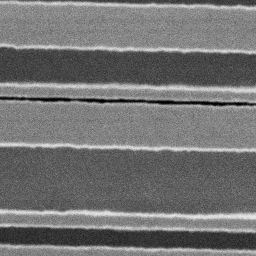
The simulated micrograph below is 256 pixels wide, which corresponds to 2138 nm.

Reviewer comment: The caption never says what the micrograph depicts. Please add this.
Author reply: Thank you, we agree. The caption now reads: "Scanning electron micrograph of lines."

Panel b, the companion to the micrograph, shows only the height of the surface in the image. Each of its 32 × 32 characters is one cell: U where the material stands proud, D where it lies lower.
UUUUUUUUUUUUDDDDDDDDDDDDDDDDDDDD
UUUUUUUUUUUUUUUUUUUUUUUUUUUUUUUU
UUUUUUUUUUUUUUUUUUUUUUUUUUUUUUUU
UUUUUUUUUUUUUUUUUUUUUUUUUUUUUUUU
UUUUUUUUUUUUUUUUUUUUUUUUUUUUUUUU
UUUUUUUUUUUUUUUUUUUUUUUUUUUUUUUU
DDDDDDDDDDDDDDDDDDDDDDDDDDDDDDDU
DDDDDDDDDDDDDDDDDDDDDDDDDDDDDDDD
DDDDDDDDDDDDDDDDDDDDDDDDDDDDDDDD
DDDDDDDDDDDDDDDDDDDDDDDDDDDDDDDD
DDDDDDDDDDDDDDDDDDDDDDDDDDDDDDDD
UUUUUUUUUUUUUUUUUUUUUUUUUUUUUUUU
UUUUUUUUUUUUUUUUUUUUUUUUUUUUUUUU
UUUUUUUUUUUUUUUUUUUUUUUUUUUUUUUU
UUUUUUUUUUUUUUUUUUUUUUUUUUUUUUUU
UUUUUUUUUUUUUUUUUUUUUUUUUUUUUUUU
UUUUUUUUUUUUUUUUUUUUUUUUUUUUUUUU
UUUUUUUUUUUUUUUUUUUUUUUUUUUUUUUU
DDDDDDDDDDDDDDDDUUUUUUUUUUUUUUUU
DDDDDDDDDDDDDDDDDDDDDDDDDDDDDDDD
DDDDDDDDDDDDDDDDDDDDDDDDDDDDDDDD
DDDDDDDDDDDDDDDDDDDDDDDDDDDDDDDD
DDDDDDDDDDDDDDDDDDDDDDDDDDDDDDDD
DDDDDDDDDDDDDDDDDDDDDDDDDDDDDDDD
DDDDDDDDDDDDDDDDDDDDDDDDDDDDDDDD
DDDDDDDDDDDDDDDDDDDDDDDDDDDDDDDD
DDDDDDDDDDDDDDDDDDDDDDDDDDDDDDDD
UUUUUUUUUUUUUUUUUUUUUUUUUUUUUUUU
DDDDDDDDDDDDUUUUUUUUUUUUUUUUUUUU
DDDDDDDDDDDDDDDDDDDDDDDDDDDDDDDD
DDDDDDDDDDDDDDDDDDDDDDDDDDDDDDDD
UUUUUUUUUUUUUUUUUUUUUUUUUUUUUUUU